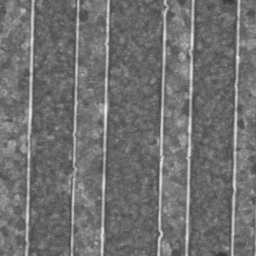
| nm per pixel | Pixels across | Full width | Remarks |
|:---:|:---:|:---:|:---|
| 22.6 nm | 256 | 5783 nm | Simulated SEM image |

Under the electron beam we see one or a few lines or trenches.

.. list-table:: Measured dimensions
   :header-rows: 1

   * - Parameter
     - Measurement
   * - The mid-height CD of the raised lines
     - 0.634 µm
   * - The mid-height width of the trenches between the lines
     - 1040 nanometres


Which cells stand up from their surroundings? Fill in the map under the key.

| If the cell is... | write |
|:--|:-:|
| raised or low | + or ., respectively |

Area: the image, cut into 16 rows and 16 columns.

++...++...++...+
++...++...++...+
++...++...++...+
++...++...++...+
++...++...++...+
++...++...++...+
++...++...++...+
++...++...++...+
++...++...++...+
++...++...++...+
++...++...++...+
++...+....++...+
++...+....++...+
++...+....++...+
++...+....++...+
++..++....++...+